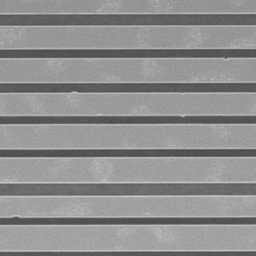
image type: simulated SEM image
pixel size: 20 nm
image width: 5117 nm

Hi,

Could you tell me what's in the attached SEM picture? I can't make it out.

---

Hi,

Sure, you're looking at parallel lines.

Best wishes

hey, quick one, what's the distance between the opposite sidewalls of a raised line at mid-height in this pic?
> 492 nm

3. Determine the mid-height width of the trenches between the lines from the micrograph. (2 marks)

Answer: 170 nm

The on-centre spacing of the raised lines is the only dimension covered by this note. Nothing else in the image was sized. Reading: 669 nm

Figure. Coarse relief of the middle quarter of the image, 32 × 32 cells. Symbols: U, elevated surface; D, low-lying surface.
UUUUUUUUUUUUUUUUUUUUUUUUUUUUUUUU
UUUUUUUUUUUUUUUUUUUUUUUUUUUUUUUU
UUUUUUUUUUUUUUUUUUUUUUUUUUUUUUUU
UUUUUUUUUUUUUUUUUUUUUUUUUUUUUUUU
UUUUUUUUUUUUUUUUUUUUUUUUUUUUUUUU
DDDDDDDDDDDDDDDDDDDDDDDDDDDDDDDD
DDDDDDDDDDDDDDDDDDDDDDDDDDDDDDDD
UUUUUUUUUUUUUUUUUUUUUUUUUUUUUUUU
UUUUUUUUUUUUUUUUUUUUUUUUUUUUUUUU
UUUUUUUUUUUUUUUUUUUUUUUUUUUUUUUU
UUUUUUUUUUUUUUUUUUUUUUUUUUUUUUUU
UUUUUUUUUUUUUUUUUUUUUUUUUUUUUUUU
UUUUUUUUUUUUUUUUUUUUUUUUUUUUUUUU
DDDDDDDDDDDDDDDDDDDDDDDDDDDDDDDD
DDDDDDDDDDDDDDDDDDDDDDDDDDDDDDDD
UUUUUUUUUUUUUUUUUUUUUUUUUUUUUUUU
UUUUUUUUUUUUUUUUUUUUUUUUUUUUUUUU
UUUUUUUUUUUUUUUUUUUUUUUUUUUUUUUU
UUUUUUUUUUUUUUUUUUUUUUUUUUUUUUUU
UUUUUUUUUUUUUUUUUUUUUUUUUUUUUUUU
UUUUUUUUUUUUUUUUUUUUUUUUUUUUUUUU
DDDDDDDDDDDDDDDDDDDDDDDDDDDDDDDD
DDDDDDDDDDDDDDDDDDDDDDDDDDDDDDDD
DDDDDUUUUUUUUUUUUUUUUUUUUUUUUUUU
UUUUUUUUUUUUUUUUUUUUUUUUUUUUUUUU
UUUUUUUUUUUUUUUUUUUUUUUUUUUUUUUU
UUUUUUUUUUUUUUUUUUUUUUUUUUUUUUUU
UUUUUUUUUUUUUUUUUUUUUUUUUUUUUUUU
UUUUUUUUUUUUUUUUUUUUUUUUUUUUUUUU
UUUUUUUUUUUUUUUUUUUUUUUUUUUUUUUU
DDDDDDDDDDDDDDDDDDDDDDDDDDDDDDDD
DDDDDDDDDDDDDDDDDDDDDDDDDDDDDDDD